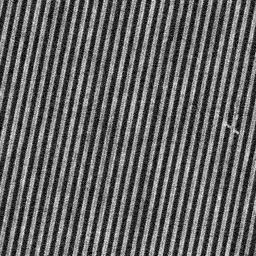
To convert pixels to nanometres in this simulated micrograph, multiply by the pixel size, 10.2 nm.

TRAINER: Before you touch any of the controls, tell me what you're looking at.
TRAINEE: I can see parallel lines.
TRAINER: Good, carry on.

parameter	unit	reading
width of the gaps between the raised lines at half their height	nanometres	60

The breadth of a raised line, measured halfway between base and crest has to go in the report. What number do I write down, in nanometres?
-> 33.7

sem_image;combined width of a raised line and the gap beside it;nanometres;95.3